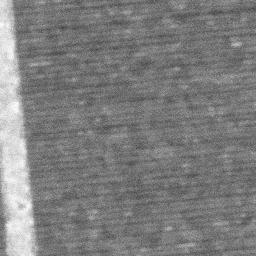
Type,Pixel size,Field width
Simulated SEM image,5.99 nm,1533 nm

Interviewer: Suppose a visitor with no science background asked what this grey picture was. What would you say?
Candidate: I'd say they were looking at parallel lines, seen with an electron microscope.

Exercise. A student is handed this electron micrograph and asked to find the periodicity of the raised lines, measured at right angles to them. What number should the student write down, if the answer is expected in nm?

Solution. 36.5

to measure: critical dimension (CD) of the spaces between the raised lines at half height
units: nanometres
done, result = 14.9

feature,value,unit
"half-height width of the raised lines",24.6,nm